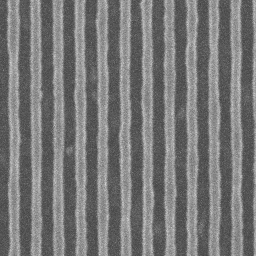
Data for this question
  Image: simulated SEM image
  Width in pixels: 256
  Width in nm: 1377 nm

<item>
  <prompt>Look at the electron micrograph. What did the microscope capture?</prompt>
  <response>parallel lines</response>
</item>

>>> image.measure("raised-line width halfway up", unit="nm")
47.1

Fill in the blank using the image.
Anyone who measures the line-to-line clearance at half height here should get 73.3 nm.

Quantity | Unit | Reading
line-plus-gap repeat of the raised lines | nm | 120